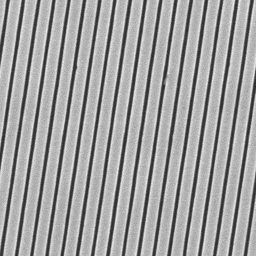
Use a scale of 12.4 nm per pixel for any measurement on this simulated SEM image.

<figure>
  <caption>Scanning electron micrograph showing parallel lines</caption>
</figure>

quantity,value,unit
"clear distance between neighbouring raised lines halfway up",52.3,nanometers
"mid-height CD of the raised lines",140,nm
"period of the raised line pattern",188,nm